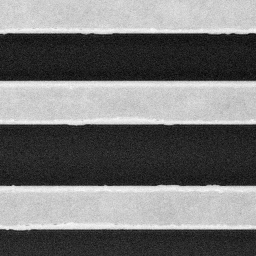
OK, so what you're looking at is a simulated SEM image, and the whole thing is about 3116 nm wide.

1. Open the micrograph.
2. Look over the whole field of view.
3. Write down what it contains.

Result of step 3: lines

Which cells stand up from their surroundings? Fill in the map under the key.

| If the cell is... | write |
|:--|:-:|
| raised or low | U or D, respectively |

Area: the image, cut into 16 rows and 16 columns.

UUUUUUUUUUUUUUUU
UUUUUUUUUUUUUUUU
DDDDDDDDDDDDDDDD
DDDDDDDDDDDDDDDD
DDDDDDDDDDDDDDDD
UUUUUUUUUUUUUUUU
UUUUUUUUUUUUUUUU
UUUUUUUUUUUUUUUU
DDDDDDDDDDDDDDDD
DDDDDDDDDDDDDDDD
DDDDDDDDDDDDDDDD
DDDDDDDDDDDDDDDD
UUUUUUUUUUUUUUUU
UUUUUUUUUUUUUUUU
DDDDDDDDDDDDDDDD
DDDDDDDDDDDDDDDD